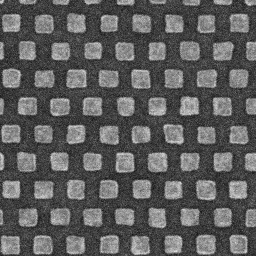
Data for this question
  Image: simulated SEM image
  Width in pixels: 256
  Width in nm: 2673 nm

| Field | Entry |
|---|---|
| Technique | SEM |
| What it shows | a regular array of raised bodies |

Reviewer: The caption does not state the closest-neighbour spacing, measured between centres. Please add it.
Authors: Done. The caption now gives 328 nanometers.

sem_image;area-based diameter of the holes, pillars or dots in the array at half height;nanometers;196